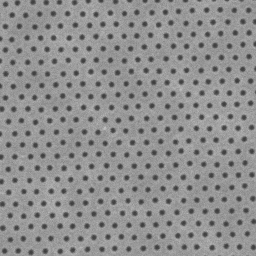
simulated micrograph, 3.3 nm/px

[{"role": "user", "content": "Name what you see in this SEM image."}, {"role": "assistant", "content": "a regular array of holes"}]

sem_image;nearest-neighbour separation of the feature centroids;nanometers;42.2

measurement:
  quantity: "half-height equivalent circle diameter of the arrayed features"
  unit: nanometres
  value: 17.5